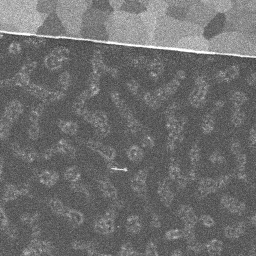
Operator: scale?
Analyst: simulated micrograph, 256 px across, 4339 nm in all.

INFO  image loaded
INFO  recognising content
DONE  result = one or a few lines or trenches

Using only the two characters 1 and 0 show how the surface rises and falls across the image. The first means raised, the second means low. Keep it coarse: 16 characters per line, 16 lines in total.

1111111111111111
1111111111111111
0000001111111111
0000000000000001
0000000000000000
0000000000000000
0000000000000000
0000000000000000
0000000000000000
0000000000000000
0000000000000000
0000000000000000
0000000000000000
0000000000000000
0000000000000000
0000000000000000